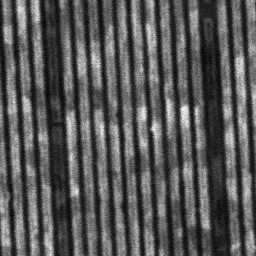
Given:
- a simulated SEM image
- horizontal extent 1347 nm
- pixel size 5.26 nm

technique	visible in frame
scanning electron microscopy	parallel lines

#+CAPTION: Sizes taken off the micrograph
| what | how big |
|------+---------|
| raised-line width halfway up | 40.1 nm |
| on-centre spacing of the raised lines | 14.3 px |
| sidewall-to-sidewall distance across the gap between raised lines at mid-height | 34.8 nm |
